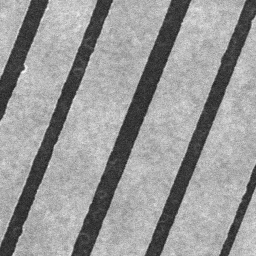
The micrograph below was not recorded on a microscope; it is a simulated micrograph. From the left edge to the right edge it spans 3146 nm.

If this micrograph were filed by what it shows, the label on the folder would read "one or a few lines or trenches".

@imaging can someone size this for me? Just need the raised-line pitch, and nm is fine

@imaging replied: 843